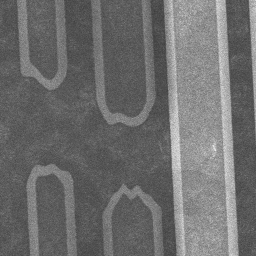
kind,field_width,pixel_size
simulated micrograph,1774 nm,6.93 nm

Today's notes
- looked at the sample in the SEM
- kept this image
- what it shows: one or a few lines or trenches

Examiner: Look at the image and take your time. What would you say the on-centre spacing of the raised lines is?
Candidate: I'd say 527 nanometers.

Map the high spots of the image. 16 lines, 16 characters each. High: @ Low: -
-@@@--@@@--@@@--
-@@@--@@@--@@@--
-@@@--@@@--@@@--
--@@--@@@--@@@--
--@@--@@@--@@@--
------@@@--@@@--
------@@@--@@@--
--------@--@@@--
-----------@@@--
-----------@@@--
-----------@@@--
--@@-------@@@--
--@@---@@--@@@--
--@@---@@@-@@@@-
--@@---@@@-@@@@-
--@@@--@@@-@@@@-